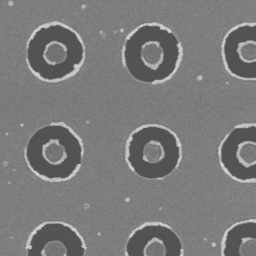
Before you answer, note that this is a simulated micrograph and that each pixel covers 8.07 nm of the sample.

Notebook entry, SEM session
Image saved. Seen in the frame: ring-shaped grooves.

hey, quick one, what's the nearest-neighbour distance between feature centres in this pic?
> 0.79 microns